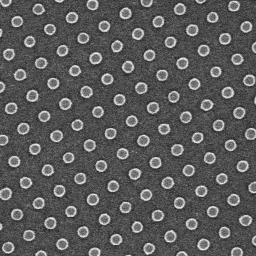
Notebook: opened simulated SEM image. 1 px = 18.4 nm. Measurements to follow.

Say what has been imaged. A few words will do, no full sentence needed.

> a regular array of raised bodies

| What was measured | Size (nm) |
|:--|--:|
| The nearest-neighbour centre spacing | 434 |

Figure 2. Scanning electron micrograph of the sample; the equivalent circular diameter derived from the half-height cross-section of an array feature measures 10.5 px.